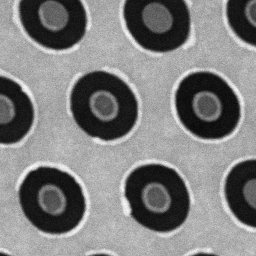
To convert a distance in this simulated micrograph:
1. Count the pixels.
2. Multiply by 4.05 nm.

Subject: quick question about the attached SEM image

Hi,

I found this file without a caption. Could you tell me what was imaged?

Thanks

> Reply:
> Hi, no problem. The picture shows ring-shaped grooves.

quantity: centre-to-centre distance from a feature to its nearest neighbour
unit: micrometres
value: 0.421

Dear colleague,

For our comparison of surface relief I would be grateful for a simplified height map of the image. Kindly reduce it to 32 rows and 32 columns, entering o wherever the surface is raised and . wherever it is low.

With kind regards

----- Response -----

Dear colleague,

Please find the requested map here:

oo...oo...oooooo.......ooooo...o
oo...ooo...oooo...ooo...oooo...o
ooo..ooo...ooooo..ooo...oooo...o
ooo...oo...ooooo...oo...ooooo...
oooo.......ooooo........oooooo..
ooooo.....ooooooo......oooooooo.
ooooooooooooooooooo..ooooooooooo
oooooooooooooooooooooooooooooooo
oooooooooooooooooooooooooooooooo
oooooooooo.....oooooooo....ooooo
..ooooooo.......oooooo......oooo
...oooooo........ooooo.......ooo
o...ooooo..ooo...ooooo..ooo...oo
oo..ooooo..oooo..ooooo..oooo..oo
oo..ooooo...oo...ooooo...oo...oo
....oooooo.......oooooo.......oo
....oooooo......oooooooo.....ooo
...oooooooooo.oooooooooooo.ooooo
oooooooooooooooooooooooooooooooo
oooooooooooooooooooooooooooooooo
ooooooooooooooooooo.oooooooooo..
oooo....oooooooo......ooooooo...
ooo......ooooooo.......ooooo....
oo...oo...oooooo..ooo..ooooo...o
oo...ooo..oooooo..ooo...oooo...o
oo...ooo...ooooo..ooo...oooo...o
ooo...oo...ooooo........ooooo...
oooo......ooooooo......ooooooo..
ooooo....ooooooooo....oooooooooo
oooooooooooooooooooooooooooooooo
oooooooooooooooooooooooooooooooo
oooooooooooooooooooooooooooooooo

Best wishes